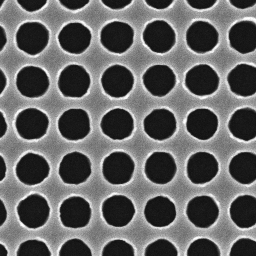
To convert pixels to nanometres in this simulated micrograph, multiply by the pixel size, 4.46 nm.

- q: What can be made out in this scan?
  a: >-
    a regular array of holes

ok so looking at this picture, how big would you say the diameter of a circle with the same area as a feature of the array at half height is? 141 nm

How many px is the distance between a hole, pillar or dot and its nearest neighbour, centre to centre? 42